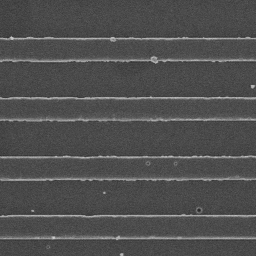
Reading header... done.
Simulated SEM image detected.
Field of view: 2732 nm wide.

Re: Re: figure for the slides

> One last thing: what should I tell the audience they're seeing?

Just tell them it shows lines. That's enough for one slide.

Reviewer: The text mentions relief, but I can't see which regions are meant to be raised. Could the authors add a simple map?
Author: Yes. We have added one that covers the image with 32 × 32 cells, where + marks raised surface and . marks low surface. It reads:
................................
................................
................................
................................
................................
++++++++++++++++++++++++++++++++
++++++++++++++++++++++++++++++++
++++++++++++++++++++++++++++++++
................................
................................
................................
................................
++++++++++++++++++++++++++++++++
++++++++++++++++++++++++++++++++
++++++++++++++++++++++++++++++++
................................
................................
................................
................................
................................
++++++++++++++++++++++++++++++++
++++++++++++++++++++++++++++++++
.++++++.........................
................................
................................
................................
................................
++++++++++++++++++++++++++++++++
++++++++++++++++++++++++++++++++
++++++++++++++++++++++++++++++++
................................
................................